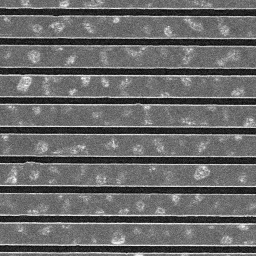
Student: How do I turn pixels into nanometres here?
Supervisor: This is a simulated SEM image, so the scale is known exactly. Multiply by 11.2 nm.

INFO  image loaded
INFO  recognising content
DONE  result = parallel lines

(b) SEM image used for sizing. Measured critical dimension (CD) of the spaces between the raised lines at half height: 88.3 nm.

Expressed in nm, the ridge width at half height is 245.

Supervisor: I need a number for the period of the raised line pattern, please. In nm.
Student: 332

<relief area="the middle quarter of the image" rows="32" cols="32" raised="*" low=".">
********************************
................................
................................
********************************
********************************
********************************
********************************
********************************
................................
................................
********************************
********************************
********************************
********************************
********************************
********************************
................................
................................
********************************
********************************
********************************
********************************
********************************
................................
................................
********************************
********************************
********************************
********************************
********************************
.............*******************
................................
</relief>